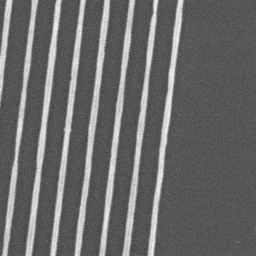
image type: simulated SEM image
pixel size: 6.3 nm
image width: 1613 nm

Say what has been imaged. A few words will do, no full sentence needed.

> parallel lines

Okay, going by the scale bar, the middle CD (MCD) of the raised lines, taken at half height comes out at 24.2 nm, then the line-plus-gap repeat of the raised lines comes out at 152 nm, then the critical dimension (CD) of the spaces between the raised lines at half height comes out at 124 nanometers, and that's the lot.